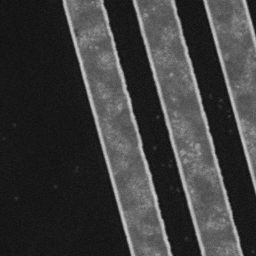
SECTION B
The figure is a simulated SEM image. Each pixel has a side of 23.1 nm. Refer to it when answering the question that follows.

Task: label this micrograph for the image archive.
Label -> one or a few lines or trenches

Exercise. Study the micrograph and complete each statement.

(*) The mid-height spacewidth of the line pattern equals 736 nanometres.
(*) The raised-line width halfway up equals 850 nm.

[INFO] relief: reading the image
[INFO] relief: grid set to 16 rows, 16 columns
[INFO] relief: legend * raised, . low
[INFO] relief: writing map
....**...**..**.
....***..**..***
.....**..**..***
.....**..***..**
.....***..**..**
.....***..**..**
......**..***..*
......**..***..*
......***..**..*
.......**..**..*
.......**..***..
.......**...**..
.......***..**..
........**..**..
........**..***.
........***..**.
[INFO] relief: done